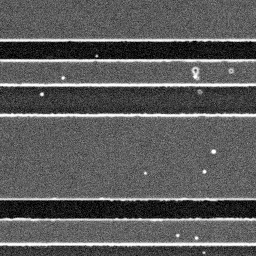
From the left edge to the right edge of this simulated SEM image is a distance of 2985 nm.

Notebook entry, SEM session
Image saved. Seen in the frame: lines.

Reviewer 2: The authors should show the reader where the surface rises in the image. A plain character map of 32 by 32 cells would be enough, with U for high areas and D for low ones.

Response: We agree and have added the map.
UUUUUUUUUUUUUUUUUUUUUUUUUUUUUUUU
UUUUUUUUUUUUUUUUUUUUUUUUUUUUUUUU
UUUUUUUUUUUUUUUUUUUUUUUUUUUUUUUU
UUUUUUUUUUUUUUUUUUUUUUUUUUUUUUUU
UUUUUUUUUUUUUUUUUUUUUUUUUUUUUUUU
DDDDDDDDDDDDDDDDDDDDDDDDDDDDDDDD
DDDDDDDDDDDDDDDDDDDDDDDDDDDDDDDD
DDDDDDDDDDDDDDDDDDDDDDDDDDDDDDDD
UUUUUUUUUUUUUUUUUUUUUUUUUUUUUUUU
UUUUUUUUUUUUUUUUUUUUUUUUUUUUUUUU
UUUUUUUUUUUUUUUUUUUUUUUUUUUUUUUU
DDDDDDDDDDDDDDDDDDDDDDDDDDDDDDDD
DDDDDDDDDDDDDDDDDDDDDDDDDDDDDDDD
DDDDDDDDDDDDDDDDDDDDDDDDDDDDDDDD
UUUUUUUUUUUUUUUUUUUUUUUUUUUUUUUU
UUUUUUUUUUUUUUUUUUUUUUUUUUUUUUUU
UUUUUUUUUUUUUUUUUUUUUUUUUUUUUUUU
UUUUUUUUUUUUUUUUUUUUUUUUUUUUUUUU
UUUUUUUUUUUUUUUUUUUUUUUUUUUUUUUU
UUUUUUUUUUUUUUUUUUUUUUUUUUUUUUUU
UUUUUUUUUUUUUUUUUUUUUUUUUUUUUUUU
UUUUUUUUUUUUUUUUUUUUUUUUUUUUUUUU
UUUUUUUUUUUUUUUUUUUUUUUUUUUUUUUU
UUUUUUUUUUUUUUUUUUUUUUUUUUUUUUUU
UUUUUUUUUUUUUUUUUUUUUUUUUUUUUUUU
DDDDDDDDDDDDDDDDDDDDDDDDDDDDDDDD
DDDDDDDDDDDDDDDDDDDDDDDDDDDDDDDD
UUUUUUUUUUUUUUUUUUUUUUUUUUUUUUUU
UUUUUUUUUUUUUUUUUUUUUUUUUUUUUUUU
UUUUUUUUUUUUUUUUUUUUUUUUUUUUUUUU
DUUUUUUUUUDUDUUUUUDUUUUDUDDDDDDU
DDDDDDDDDDDDDDDDDDDDDDDDDDDDDDDD